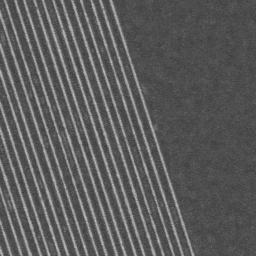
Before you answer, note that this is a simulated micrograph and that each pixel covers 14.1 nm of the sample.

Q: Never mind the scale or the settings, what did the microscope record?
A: parallel lines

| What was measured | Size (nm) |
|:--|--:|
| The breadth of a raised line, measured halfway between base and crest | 25.2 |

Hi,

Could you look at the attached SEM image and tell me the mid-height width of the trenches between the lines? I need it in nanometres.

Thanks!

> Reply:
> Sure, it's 103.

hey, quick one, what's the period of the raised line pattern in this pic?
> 129 nm